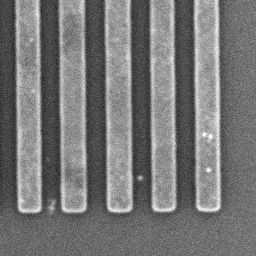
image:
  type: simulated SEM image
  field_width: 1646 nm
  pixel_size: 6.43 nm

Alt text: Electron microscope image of wiring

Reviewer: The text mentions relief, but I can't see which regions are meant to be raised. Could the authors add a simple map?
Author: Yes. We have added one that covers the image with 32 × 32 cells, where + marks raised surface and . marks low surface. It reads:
..+++..+++...+++...+++..+++.....
..+++..+++...+++...+++..+++.....
..+++..+++...+++...+++..+++.....
..+++...++...+++...+++..+++.....
..+++...++...+++...+++..+++.....
..+++...++...+++...+++..+++.....
..+++...++...+++...+++..+++.....
..+++...+++..+++...+++..+++.....
..+++...+++..+++...+++..+++.....
..+++...+++..+++...+++..+++.....
..+++...+++..+++...+++..+++.....
..+++...+++..+++...+++...++.....
..+++...+++..+++...+++...++.....
..+++...+++..+++...+++...++.....
..+++...+++..+++...+++...++.....
..+++...+++..+++...+++...++.....
..+++...+++..+++...+++...++.....
..+++...+++..+++...+++...++.....
..+++...+++..+++...+++...++.....
..+++...+++..+++...+++...++.....
..+++...+++..+++...+++...++.....
..+++...+++..+++...+++...++.....
..+++...+++..+++...+++...++.....
..+++...+++..+++...+++...++.....
..+++...+++..+++...+++...++.....
..+++...+++..+++...+++...++.....
................................
................................
................................
................................
................................
................................